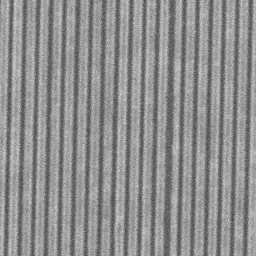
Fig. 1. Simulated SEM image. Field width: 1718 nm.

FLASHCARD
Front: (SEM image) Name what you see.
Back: parallel lines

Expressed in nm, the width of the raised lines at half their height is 45.3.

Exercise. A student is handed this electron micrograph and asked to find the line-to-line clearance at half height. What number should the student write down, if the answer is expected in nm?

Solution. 45.3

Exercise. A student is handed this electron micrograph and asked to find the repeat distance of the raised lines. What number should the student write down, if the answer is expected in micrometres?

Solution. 0.0892